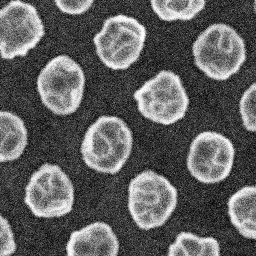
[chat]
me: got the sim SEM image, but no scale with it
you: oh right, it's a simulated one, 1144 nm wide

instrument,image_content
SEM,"a regular array of raised bodies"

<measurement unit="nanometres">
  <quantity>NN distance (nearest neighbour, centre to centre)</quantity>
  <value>322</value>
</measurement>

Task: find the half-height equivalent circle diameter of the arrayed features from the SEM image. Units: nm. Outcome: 218